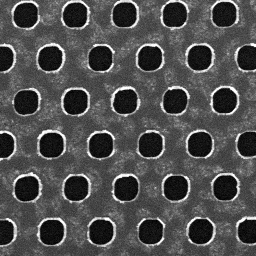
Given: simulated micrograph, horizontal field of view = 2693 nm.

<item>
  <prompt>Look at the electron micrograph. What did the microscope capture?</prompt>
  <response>a regular array of holes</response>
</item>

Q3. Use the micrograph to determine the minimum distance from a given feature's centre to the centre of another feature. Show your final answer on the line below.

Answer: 0.52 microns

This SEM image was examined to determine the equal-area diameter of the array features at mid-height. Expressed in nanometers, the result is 273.